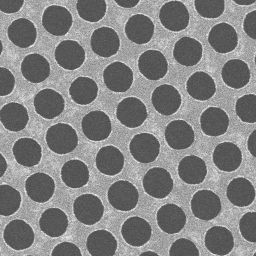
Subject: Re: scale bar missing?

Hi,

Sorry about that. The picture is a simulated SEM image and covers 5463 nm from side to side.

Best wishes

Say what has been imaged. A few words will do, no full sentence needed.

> a regular array of holes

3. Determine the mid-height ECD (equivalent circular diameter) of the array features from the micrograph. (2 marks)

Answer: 644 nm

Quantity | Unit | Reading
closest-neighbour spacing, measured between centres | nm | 790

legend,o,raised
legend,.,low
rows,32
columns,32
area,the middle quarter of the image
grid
....ooooooo.....ooo.......oooo..
o.oooooooo.......oo.......oooooo
oooooooooo.......oo......ooooooo
ooo....ooo.......ooo.....oooooo.
oo......oo.......oooooooooooooo.
oo......ooo......ooooooo...ooo..
o........oo.....ooooooo.....ooo.
o.......oooooooooooooo.......oo.
oo......ooooooo...oooo.......ooo
ooo....ooooooo......oo.......ooo
ooooooooooooo.......oo.......ooo
ooooooooooooo........oo.....oooo
oooooo.....oo........ooo...ooooo
ooooo......oo........ooooooooooo
oooo........oo......ooooooo....o
..oo........ooo....ooooooo......
...oo.......ooooooooooooo.......
...oo.......oooooo....ooo.......
...ooo.....oooooo......oo.......
...ooooooooooooo........oo......
...ooooooo..oooo........oo......
..ooooooo.....oo........oooooooo
oooooooo.......oo.......oooooooo
oooooooo.......oo......ooooooo..
.....ooo.......oooo...ooooooo...
......oo.......oooooooooooooo...
......oo......ooooooo.....oo....
......oooo...ooooooo.......oo...
......oooooooooooooo.......oo...
......ooooooo...oooo.......ooo..
o....ooooooo......oo.......ooooo
ooooooooooo.......oo.......ooooo